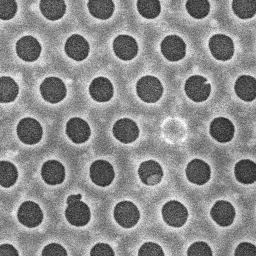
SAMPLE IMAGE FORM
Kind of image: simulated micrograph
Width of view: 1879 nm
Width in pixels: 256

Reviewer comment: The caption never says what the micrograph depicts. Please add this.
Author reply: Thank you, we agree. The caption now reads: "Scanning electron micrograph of a regular array of holes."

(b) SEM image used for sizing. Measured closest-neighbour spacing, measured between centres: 349 nanometers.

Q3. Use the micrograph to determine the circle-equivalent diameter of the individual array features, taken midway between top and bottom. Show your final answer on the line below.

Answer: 195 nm